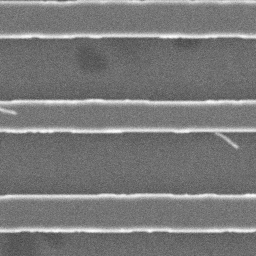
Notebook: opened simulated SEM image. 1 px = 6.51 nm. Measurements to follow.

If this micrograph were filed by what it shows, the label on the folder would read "lines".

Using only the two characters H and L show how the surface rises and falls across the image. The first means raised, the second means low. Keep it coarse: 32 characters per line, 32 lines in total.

HHHHHHHHHHHHHHHHHHHHHHHHHHHHHHHH
HHHHHHHHHHHHHHHHHHHHHHHHHHHHHHHH
HHHHHHHHHHHHHHHHHHHHHHHHHHHHHHHH
HHHHHHHHHHHHHHHHHHHHHHHHHHHHHHHH
HHHHHHHHHHHHHHHHHHHHHHHHHHHHHHHH
LLLLLLLLLLLLLLLLLLLLLLLLLLLLLLLL
LLLLLLLLLLLLLLLLLLLLLLLLLLLLLLLL
LLLLLLLLLLLLLLLLLLLLLLLLLLLLLLLL
LLLLLLLLLLLLLLLLLLLLLLLLLLLLLLLL
LLLLLLLLLLLLLLLLLLLLLLLLLLLLLLLL
LLLLLLLLLLLLLLLLLLLLLLLLLLLLLLLL
LLLLLLLLLLLLLLLLLLLLLLLLLLLLLLLL
LLLLLLLLLLLLLLLLLLLLLLLLLLLLLLLL
HHHHHHHHHHHHHHHHHHHHHHHHHHHHHHHH
HHHHHHHHHHHHHHHHHHHHHHHHHHHHHHHH
HHHHHHHHHHHHHHHHHHHHHHHHHHHHHHHH
LLLLLLLLLLLLLLLLLLLLLLLLLLLLLLLL
LLLLLLLLLLLLLLLLLLLLLLLLLLLLLLLL
LLLLLLLLLLLLLLLLLLLLLLLLLLLLLLLL
LLLLLLLLLLLLLLLLLLLLLLLLLLLLLLLL
LLLLLLLLLLLLLLLLLLLLLLLLLLLLLLLL
LLLLLLLLLLLLLLLLLLLLLLLLLLLLLLLL
LLLLLLLLLLLLLLLLLLLLLLLLLLLLLLLL
LLLLLLLLLLLLLLLLLLLLLLLLLLLLLLLL
HHHHHHHHHHHHHHHHHHHHHHHHHHHHHHHH
HHHHHHHHHHHHHHHHHHHHHHHHHHHHHHHH
HHHHHHHHHHHHHHHHHHHHHHHHHHHHHHHH
HHHHHHHHHHHHHHHHHHHHHHHHHHHHHHHH
HHHHHHHHHHHHHHHHHHHHHHHHHHHHHHHH
LLLLLLLLLLLLLLLLLLLLLLLLLLLLLLLL
LLLLLLLLLLLLLLLLLLLLLLLLLLLLLLLL
LLLLLLLLLLLLLLLLLLLLLLLLLLLLLLLL